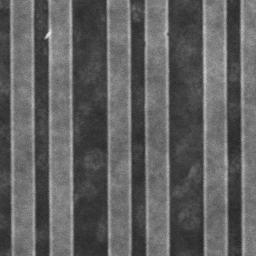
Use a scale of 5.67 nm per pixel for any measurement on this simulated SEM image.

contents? parallel lines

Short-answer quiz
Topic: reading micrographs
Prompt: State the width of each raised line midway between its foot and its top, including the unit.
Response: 21.4 px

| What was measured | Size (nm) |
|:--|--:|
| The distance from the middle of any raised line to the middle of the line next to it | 273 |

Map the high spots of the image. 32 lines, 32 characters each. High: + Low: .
..++..+++....+++..+++.....++..++
..++..+++.....++..+++.....++..++
..++..+++.....++..+++.....++..++
..++..+++.....++..+++.....++..++
..++..+++.....++..+++.....++..++
..++..+++.....++..+++.....++..++
..++..+++.....++..+++.....++..++
..++..+++.....++..+++.....++..++
..++..+++.....++..+++.....++..++
..++..+++.....++..+++.....++..++
..++..+++.....++..+++.....++..++
..++..+++.....++..+++.....++..++
..++..+++.....++..+++.....++..++
..++..+++.....++..+++.....++..++
..++..+++.....++..+++.....++..++
..++..+++.....++..+++.....++..++
..++..+++.....++..+++.....++..++
..++..+++.....++..+++.....++..++
..++..+++.....++..+++.....++..++
..++..+++.....++..+++.....++..++
..++..+++.....++..+++.....++..++
..++..+++.....++..+++.....++..++
..++..+++.....++..+++.....++..++
..++..+++.....++..+++.....++..++
..++..+++.....++..+++.....++..++
..++..+++.....++..+++.....++..++
..++..+++.....++..+++.....++..++
..++..+++.....++..+++.....++..++
..++..+++.....++..+++.....++..++
..++..+++.....++..+++.....++..++
..++..+++.....++..+++.....++..++
..++..+++.....++..+++.....++..++